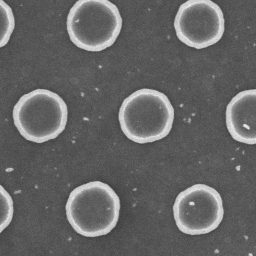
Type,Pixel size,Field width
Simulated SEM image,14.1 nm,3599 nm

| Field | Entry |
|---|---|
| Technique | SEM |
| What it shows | raised bodies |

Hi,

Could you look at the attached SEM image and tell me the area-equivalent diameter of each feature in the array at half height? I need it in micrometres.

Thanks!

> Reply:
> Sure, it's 0.703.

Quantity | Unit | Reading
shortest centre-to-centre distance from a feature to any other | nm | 1480